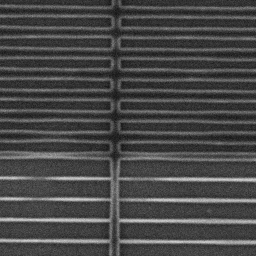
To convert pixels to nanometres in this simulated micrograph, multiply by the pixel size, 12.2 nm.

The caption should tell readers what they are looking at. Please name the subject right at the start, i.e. groups of lines, slits or small figures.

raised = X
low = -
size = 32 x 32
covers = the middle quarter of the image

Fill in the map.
------------XX------------------
XXXXXXXXXXXXXXXXXXXXXXXXXXXXX---
XXXXXXXXXXXXXXXXXXXXXXXXXXXXXXXX
XXXXXXXXXXXXXXXXXXXXXXXXXXXXXXXX
------------XX------------------
------------XX------------------
XXXXXXXXXXXXXXXXXXXXXXXXXXX-----
XXXXXXXXXXXXXXXXXXXXXXXXXXXXXXXX
XXXXXXXXXXXXXXXXXXXXXXXXXXXXXXXX
------------XX------------------
------------XX------------------
------------XX------------------
XXXXXXXXXXXXXXXXXXXXXXXXXXXXXXXX
XXXXXXXXXXXXXXXXXXXXXXXXXXXXXXXX
-----------XXXXX----------------
------------XX------------------
------------XX------------------
XXXXXXXXXXXXXXXXXXXXXXXXXXXXXXXX
XXXXXXXXXXXXXXXXXXXXXXXXXXXXXXXX
------XXXXXXXXXXXXXXXXXXXXXXXXXX
------------XX------------------
------------XX------------------
XXXXXXXXXXXXXXXXXXXXXXXXXXXXXXXX
XXXXXXXXXXXXXXXXXXXXXXXXXXXXXXXX
------------XX------------------
------------XX------------------
------------XX------------------
------------XX------------------
------------XX------------------
------------XX------------------
------------X-------------------
------------X-------------------